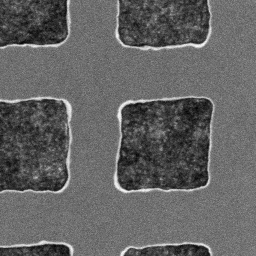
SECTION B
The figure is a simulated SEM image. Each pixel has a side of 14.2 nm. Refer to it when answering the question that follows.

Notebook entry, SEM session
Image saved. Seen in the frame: holes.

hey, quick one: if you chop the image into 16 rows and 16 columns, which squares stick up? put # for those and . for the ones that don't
....###......###
....###......###
....####.....###
################
################
################
....####.....###
....####.....###
....####.....###
....###......###
....###......###
....###......###
################
################
################
....#####....###